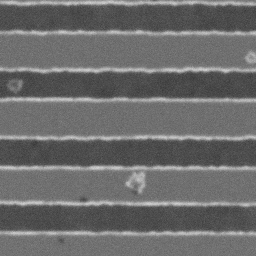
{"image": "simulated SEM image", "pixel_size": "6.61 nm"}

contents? lines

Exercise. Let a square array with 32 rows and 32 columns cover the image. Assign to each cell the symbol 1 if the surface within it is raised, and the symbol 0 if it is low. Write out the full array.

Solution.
00111000100000011000010000110111
00000000000000000000000000000000
00000000000000000000000000000000
00000000000000000000000000000000
11111111111111111111111111111111
11111111111111111111111111111111
11111111111111111111111111111111
11111111111111111111111111111111
11111111111111111111111111111111
00000000000000000000000000000000
00000000000000000000000000000000
00000000000000000000000000000000
11111111111111111111111111111111
11111111111111111111111111111111
11111111111111111111111111111111
11111111111111111111111111111111
11111111111111111111111111111111
00000000000000000000000000000000
00000000000000000000000000000000
00000000000000000000000000000000
00000000000000000000000000000000
11111111111111111111111111111111
11111111111111111111111111111111
11111111111111111111111111111111
11111111111111111111111111111111
00100000111110011111111111111111
00000000000000000000000000000000
00000000000000000000000000000000
00000000000000000000000000000000
11111111111111111111111111111111
11111111111111111111111111111111
11111111111111111111111111111111